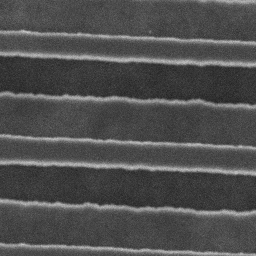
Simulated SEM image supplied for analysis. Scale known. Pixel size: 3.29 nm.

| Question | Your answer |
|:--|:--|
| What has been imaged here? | lines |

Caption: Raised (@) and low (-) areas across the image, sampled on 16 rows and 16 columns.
@@@@@@@@@@@@@@@@
@@@@@@@@@@@@@@@@
@@@@@@@@@@@@@@@@
--@@@@@@@@@@@@@@
----------------
----------------
@@@@@@@@@@@@@---
@@@@@@@@@@@@@@@@
@@@@@@@@@@@@@@@@
@@@@@@@@@@@@@@@@
---------@@@@@@@
----------------
----------------
@@@@@@@@@@@@@@@@
@@@@@@@@@@@@@@@@
@@@@@@@@@@@@@@@@